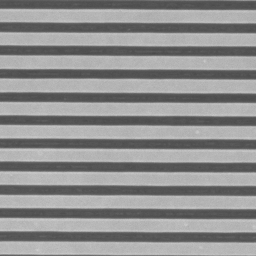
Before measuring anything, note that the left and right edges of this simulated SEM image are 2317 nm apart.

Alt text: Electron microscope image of parallel lines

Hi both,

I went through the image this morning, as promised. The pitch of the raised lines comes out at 210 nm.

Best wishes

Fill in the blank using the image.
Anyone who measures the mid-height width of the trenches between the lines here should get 80.4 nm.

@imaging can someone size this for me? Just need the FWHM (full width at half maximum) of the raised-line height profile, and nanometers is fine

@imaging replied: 128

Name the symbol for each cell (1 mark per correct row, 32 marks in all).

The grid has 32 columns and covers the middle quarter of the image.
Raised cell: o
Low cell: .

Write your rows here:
oooooooooooooooooooooooooooooooo
..........................oooooo
................................
................................
oooooooooooooooooooooooooooooooo
oooooooooooooooooooooooooooooooo
oooooooooooooooooooooooooooooooo
................................
................................
................................
oooooooooooooooooooooooooooooooo
oooooooooooooooooooooooooooooooo
oooooooooooooooooooooooooooooooo
................................
................................
oooooooooooooooooooooooooooooooo
oooooooooooooooooooooooooooooooo
oooooooooooooooooooooooooooooooo
oooooooooooooooooooooooooooooooo
................................
................................
oooooooooooooooooooooooooooooooo
oooooooooooooooooooooooooooooooo
oooooooooooooooooooooooooooooooo
oooooooooooooooooooooooooooooooo
................................
................................
oooooooooooooooooooooooooooooooo
oooooooooooooooooooooooooooooooo
oooooooooooooooooooooooooooooooo
........................o.......
................................